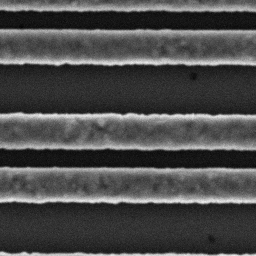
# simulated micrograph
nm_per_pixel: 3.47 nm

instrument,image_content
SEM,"lines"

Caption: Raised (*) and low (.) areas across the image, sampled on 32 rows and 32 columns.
********************************
................................
................................
................................
********************************
********************************
********************************
********************************
................................
................................
................................
................................
................................
................................
***************.**.**.****.*.**.
********************************
********************************
********************************
.**.*********.******************
................................
................................
********************************
********************************
********************************
********************************
................................
................................
................................
................................
................................
................................
................................